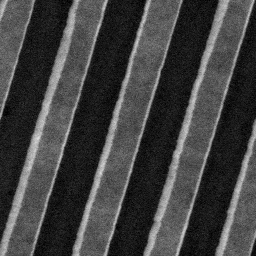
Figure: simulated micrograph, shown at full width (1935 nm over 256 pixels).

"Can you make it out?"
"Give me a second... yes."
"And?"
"lines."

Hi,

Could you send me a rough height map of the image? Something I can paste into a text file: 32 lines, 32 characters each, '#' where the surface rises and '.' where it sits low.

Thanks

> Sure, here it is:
####.....####.....#####.....####
####.....####.....####.....####.
####.....####.....####.....####.
###.....####.....#####.....####.
###.....####.....####.....#####.
###.....####.....####.....####..
##......####.....####.....####..
##.....####.....#####....#####..
##.....####.....####.....####...
##.....####.....####.....####...
#.....####.....#####....#####...
#.....####.....####.....####....
#.....####.....####.....####....
.....#####.....####.....####....
.....####.....####.....####.....
.....####.....####.....####.....
.....####.....####.....####.....
....####.....#####....#####....#
....####.....####.....####.....#
....####.....####.....####.....#
...####......####.....####....##
...####.....####.....####.....##
...####.....####.....####.....##
..#####.....####.....####.....##
..####.....#####....####.....###
..####.....####.....####.....###
..####.....####.....####.....###
.####.....#####.....####.....###
.####.....####.....####.....####
.####.....####.....####.....####
#####.....####.....####.....####
####.....####.....####.....####.